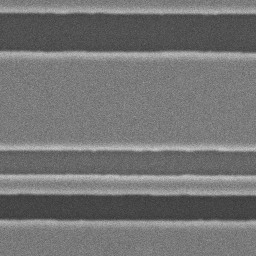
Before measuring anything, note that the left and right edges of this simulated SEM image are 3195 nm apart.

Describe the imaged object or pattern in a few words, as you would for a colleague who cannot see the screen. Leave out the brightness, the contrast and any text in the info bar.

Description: lines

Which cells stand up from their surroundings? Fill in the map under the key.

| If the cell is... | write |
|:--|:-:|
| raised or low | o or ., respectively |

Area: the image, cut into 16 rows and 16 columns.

oooooooooooooooo
................
................
oooooooooooooooo
oooooooooooooooo
oooooooooooooooo
oooooooooooooooo
oooooooooooooooo
oooooooooooooooo
oooooooooooooooo
oooooooooooooooo
oooooooooooooooo
................
................
oooooooooooooooo
oooooooooooooooo